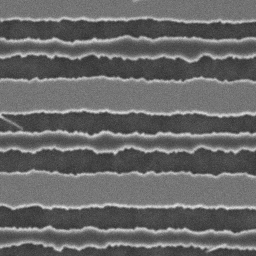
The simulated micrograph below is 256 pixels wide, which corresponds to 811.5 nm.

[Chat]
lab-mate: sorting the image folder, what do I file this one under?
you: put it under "lines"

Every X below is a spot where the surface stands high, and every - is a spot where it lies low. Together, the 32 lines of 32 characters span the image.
XXXXXXXXXXXXXXXXXXXXXXXXXXXXXXXX
XXXXXXXXXXXXXXXXXXXXXXXXXXXXXXXX
X---XX-----XX--X-----XXXXXXXXXXX
--------------------------------
---------------X----------------
XXXXXXXXXXXXXXXXXXXXXXXXXXXXXXXX
XXXXXXXXXXXXXXXXXXXXXXXXXXXXXXXX
-----------------------XX-------
--------------------------------
--------------------------------
XXXXXXXXXXXXXXXXXXXXXXXXXXXXXXXX
XXXXXXXXXXXXXXXXXXXXXXXXXXXXXXXX
XXXXXXXXXXXXXXXXXXXXXXXXXXXXXXXX
XXXXXXXXXXXXXXXXXXXXXXXXXXXXXXXX
--------------------------------
--------------------------------
--X--XXX-----X------------------
XXXXXXXXXXXXXXXXXXXXXXXXXXXXXXXX
XXXXXXXXXXXXXXXXXXXXXXXXX-XXXXXX
--------------------------------
--------------------------------
---XXX---------------XX---------
XXXXXXXXXXXXXXXXXXXXXXXXXXXXXXXX
XXXXXXXXXXXXXXXXXXXXXXXXXXXXXXXX
XXXXXXXXXXXXXXXXXXXXXXXXXXXXXXXX
XXXXXXXXXXXXXXXXXXXXXXXXXXXXXXXX
--------------------------------
--------------------------------
------X----X--------------------
XXXXXXXXXXXXXXXXXXXXXXXXXXXXXXXX
XXX--XXXXXXXXXXXXXXXXXXXXXXXXXXX
--------------------------------